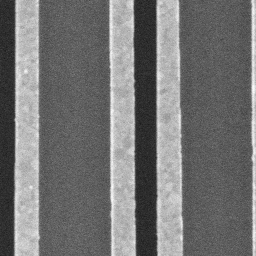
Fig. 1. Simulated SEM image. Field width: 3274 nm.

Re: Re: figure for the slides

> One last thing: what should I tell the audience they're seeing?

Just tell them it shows lines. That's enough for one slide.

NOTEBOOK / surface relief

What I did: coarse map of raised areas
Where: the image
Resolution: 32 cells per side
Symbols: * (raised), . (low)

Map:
..***.........***...**..........
..***.........***...**..........
..***.........***...**..........
..***.........***...**..........
..***.........***...**..........
..***.........***...**..........
..***.........***...**..........
..***.........***...**..........
..***.........***...**..........
..***.........***...**..........
..***.........***...**..........
..***.........***...**..........
..***.........***...**..........
..***.........***...**..........
..***.........***...**..........
..***.........***...**..........
..***.........***...**..........
..***.........***...**..........
..***.........***...**..........
..***.........***...**..........
..***.........***...***.........
..***.........***...***.........
..***.........***...***.........
..***.........***...***.........
..***.........***...***.........
..***.........***...***.........
..***.........***...***.........
..***.........***...***.........
..***.........***...***.........
..***.........***...***.........
..***.........***...***.........
..***.........***...***.........